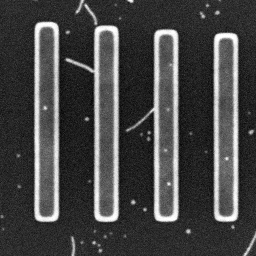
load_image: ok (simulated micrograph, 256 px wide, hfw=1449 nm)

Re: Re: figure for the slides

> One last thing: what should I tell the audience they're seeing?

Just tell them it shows groups of lines, slits or small figures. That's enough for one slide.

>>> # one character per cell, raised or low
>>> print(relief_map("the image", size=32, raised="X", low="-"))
--------------------------------
--------------------------------
--------------------------------
-----XX-------------------------
-----XX-----XXX-----XX------X---
-----XX-----XXX-----XX-----XX---
-----XX-----XXX-----XX-----XX---
-----XX-----XXX-----XX-----XX---
-----XX-----XXX-----XX-----XX---
-----XX-----XXX-----XX-----XX---
-----XX-----XXX-----XX-----XX---
-----XX-----XXX-----XX-----XX---
-----XX-----XXX-----XX-----XX---
-----XX-----XXX-----XX-----XXX--
-----XX-----XXX-----XX-----XXX--
-----XX-----XXX-----XX-----XXX--
-----XX-----XXX-----XX-----XXX--
-----XX-----XXX-----XX-----XX---
-----XX-----XXX-----XX-----XX---
-----XX-----XXX-----XX-----XX---
-----XX-----XXX-----XX-----XXX--
-----XX-----XXX-----XX-----XXX--
-----XX-----XXX-----XX-----XXX--
-----XX-----XXX-----XX-----XXX--
-----XX-----XXX-----XX-----XX---
-----XX-----XXX-----XX-----XX---
-----XX-----XXX-----XX-----XX---
--------------------------------
--------------------------------
--------------------------------
--------------------------------
--------------------------------